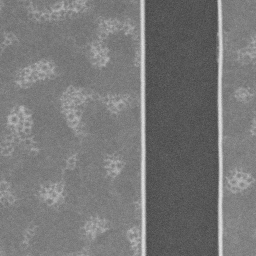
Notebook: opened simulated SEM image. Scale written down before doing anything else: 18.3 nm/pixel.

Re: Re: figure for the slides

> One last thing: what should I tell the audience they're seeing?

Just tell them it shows one or a few lines or trenches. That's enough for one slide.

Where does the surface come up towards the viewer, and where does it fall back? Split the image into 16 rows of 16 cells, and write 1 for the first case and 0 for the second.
1111111110000011
1111111110000011
1111111110000011
1111111110000011
1111111110000011
1111111110000011
1111111110000011
1111111110000011
1111111110000011
1111111110000011
1111111110000011
1111111110000011
1111111110000011
1111111110000011
1111111110000011
1111111110000011